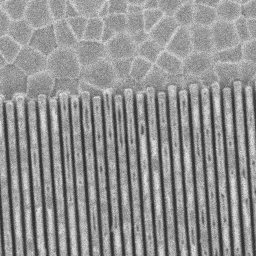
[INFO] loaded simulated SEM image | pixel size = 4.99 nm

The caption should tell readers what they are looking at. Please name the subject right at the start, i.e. parallel lines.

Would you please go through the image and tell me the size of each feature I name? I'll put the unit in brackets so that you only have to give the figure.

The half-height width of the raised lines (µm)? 0.0392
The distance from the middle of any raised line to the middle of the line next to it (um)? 0.0543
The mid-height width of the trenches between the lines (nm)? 17.4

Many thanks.